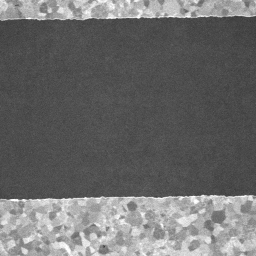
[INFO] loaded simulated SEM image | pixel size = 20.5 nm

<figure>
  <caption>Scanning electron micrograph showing one or a few lines or trenches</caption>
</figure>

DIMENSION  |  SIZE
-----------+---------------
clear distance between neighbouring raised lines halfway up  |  3680 nanometres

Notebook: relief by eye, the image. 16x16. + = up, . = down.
++++++++++++++++
................
................
................
................
................
................
................
................
................
................
................
..++++++++++++++
++++++++++++++++
++++++++++++++++
++++++++++++++++